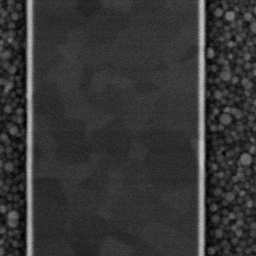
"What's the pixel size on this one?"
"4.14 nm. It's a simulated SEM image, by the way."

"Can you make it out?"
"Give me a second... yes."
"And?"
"one or a few lines or trenches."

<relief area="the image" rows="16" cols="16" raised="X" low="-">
--XXXXXXXXXXX---
--XXXXXXXXXXX---
--XXXXXXXXXXX---
--XXXXXXXXXXX---
--XXXXXXXXXXX---
--XXXXXXXXXXX---
--XXXXXXXXXXX---
--XXXXXXXXXXX---
--XXXXXXXXXXX---
--XXXXXXXXXXX---
--XXXXXXXXXXX---
--XXXXXXXXXXX---
--XXXXXXXXXXX---
--XXXXXXXXXXX---
--XXXXXXXXXXX---
--XXXXXXXXXXX---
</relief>